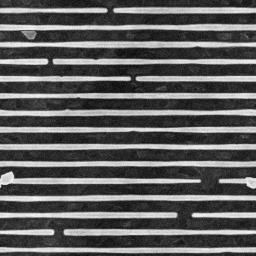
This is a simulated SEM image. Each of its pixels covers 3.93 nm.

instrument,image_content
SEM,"parallel lines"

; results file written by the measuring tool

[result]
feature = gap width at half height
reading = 50.5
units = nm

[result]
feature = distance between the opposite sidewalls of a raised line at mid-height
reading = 18.2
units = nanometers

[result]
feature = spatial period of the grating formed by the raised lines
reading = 0.0671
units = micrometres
